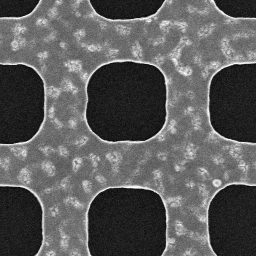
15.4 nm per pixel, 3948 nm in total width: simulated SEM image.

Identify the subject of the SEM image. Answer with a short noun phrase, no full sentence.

holes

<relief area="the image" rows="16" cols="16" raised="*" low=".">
..****....****..
****************
****************
****************
..****....****..
...**.....***...
...**.....***...
...**.....***...
..****....****..
****************
****************
****************
..****....***...
...**.....***...
...**.....***...
...***....***...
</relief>